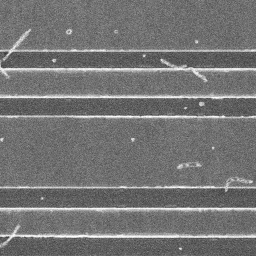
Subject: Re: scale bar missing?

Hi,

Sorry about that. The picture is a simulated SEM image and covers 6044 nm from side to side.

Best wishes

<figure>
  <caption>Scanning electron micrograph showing lines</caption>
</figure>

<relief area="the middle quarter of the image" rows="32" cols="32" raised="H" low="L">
LLLLLLLLLLLLLLLLLLLLLLLLLLLLLLLL
HHHHHHHHHHHHHHHHHHHHHHHHHHHHHHHH
HHHHHHHHHHHHHHHHHHHHHHHHHHHHHHHH
HHHHHHHHHHHHHHHHHHHHHHHHHHHHHHHH
HHHHHHHHHHHHHHHHHHHHHHHHHHHHHHHH
HHHHHHHHHHHHHHHHHHHHHHHHHHHHHHHH
HHHHHHHHHHHHHHHHHHHHHHHHHHHHHHHH
HHHHHHHHHHHHHHHHHHHHHHHHHHHHHHHH
LLLLLLLLLLLLLLLLLLLLLLLLLLLLLLLL
LLLLLLLLLLLLLLLLLLLLLLLLLLLLLLLL
LLLLLLLLLLLLLLLLLLLLLLLLLLLLLLLL
LLLLLLLLLLLLLLLLLLLLLLLLLLLLLLLL
LLLLLLLLLLLLLLLLLLLLLLLLLLLLLLLL
HHHHHHHHHHHHHHHHHHHHHHHHHHHHHHHH
HHHHHHHHHHHHHHHHHHHHHHHHHHHHHHHH
HHHHHHHHHHHHHHHHHHHHHHHHHHHHHHHH
HHHHHHHHHHHHHHHHHHHHHHHHHHHHHHHH
HHHHHHHHHHHHHHHHHHHHHHHHHHHHHHHH
HHHHHHHHHHHHHHHHHHHHHHHHHHHHHHHH
HHHHHHHHHHHHHHHHHHHHHHHHHHHHHHHH
HHHHHHHHHHHHHHHHHHHHHHHHHHHHHHHH
HHHHHHHHHHHHHHHHHHHHHHHHHHHHHHHH
HHHHHHHHHHHHHHHHHHHHHHHHHHHHHHHH
HHHHHHHHHHHHHHHHHHHHHHHHHHHHHHHH
HHHHHHHHHHHHHHHHHHHHHHHHHHHHHHHH
HHHHHHHHHHHHHHHHHHHHHHHHHHHHHHHH
HHHHHHHHHHHHHHHHHHHHHHHHHHHHHHHH
HHHHHHHHHHHHHHHHHHHHHHHHHHHHHHHH
HHHHHHHHHHHHHHHHHHHHHHHHHHHHHHHH
HHHHHHHHHHHHHHHHHHHHHHHHHHHHHHHH
HHHHHHHHHHHHHHHHHHHHHHHHHHHHHHHH
LLLLLLLLLLLLLLLLLLLLLLLLLLLLLLLL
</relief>